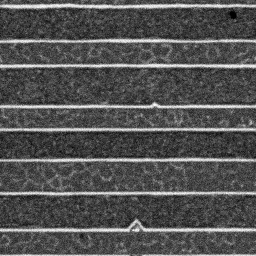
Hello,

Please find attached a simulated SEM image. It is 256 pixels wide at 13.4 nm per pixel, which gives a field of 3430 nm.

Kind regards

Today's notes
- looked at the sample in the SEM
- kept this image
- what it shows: one or a few lines or trenches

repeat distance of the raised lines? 824 nm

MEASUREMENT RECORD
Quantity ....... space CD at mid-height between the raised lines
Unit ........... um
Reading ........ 0.484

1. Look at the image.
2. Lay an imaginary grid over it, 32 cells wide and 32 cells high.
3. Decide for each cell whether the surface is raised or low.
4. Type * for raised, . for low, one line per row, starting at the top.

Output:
********************************
................................
................................
................................
................................
********************************
********************************
********************************
................................
................................
................................
................................
................................
********************************
********************************
********************************
................................
................................
................................
................................
********************************
********************************
********************************
********************************
................................
................................
................................
................................
................**..............
********************************
********************************
********************************